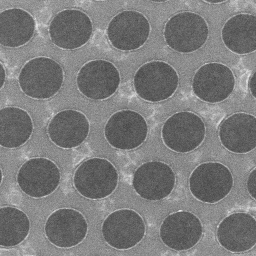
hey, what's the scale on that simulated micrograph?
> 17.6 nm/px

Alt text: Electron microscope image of a regular array of raised bodies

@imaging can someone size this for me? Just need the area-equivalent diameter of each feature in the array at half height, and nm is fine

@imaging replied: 747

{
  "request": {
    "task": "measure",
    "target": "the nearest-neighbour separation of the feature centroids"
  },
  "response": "1000 nm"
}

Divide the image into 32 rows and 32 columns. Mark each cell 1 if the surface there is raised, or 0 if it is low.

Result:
00000000000000000000000000000000
11100001110000011000000000000000
11110011111000111100011111000111
11110011111101111110011111001111
11110011111101111110111111001111
11100001111001111100011111001111
00000000000000000000001100000111
00001110000010000000000000000000
10011111001111100111110001111000
10111111001111100111110011111001
10111111001111100111110011111011
00011110001111000111110011111001
00000000000000000011100001110000
11000000000000000000000000000000
11110001111000111100011110010111
11110011111001111100111111011111
11110011111001111100111111011111
11100011111001111100111110011111
01000000100000111000011110001111
00000000000000000000000000000000
00011110001111000011100001110000
00111110011111100111110011111001
00111111011111100111110011111001
00011110011111000111110011111001
00001100001110000111100011110001
01000000000000000000000000000000
11100001110000111000001100000000
11110011111001111100111110001111
11110011111001111100111110011111
11100011111001111100111111111111
11000001110000111000011110001111
11000000000000000000000000000100